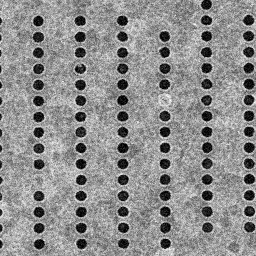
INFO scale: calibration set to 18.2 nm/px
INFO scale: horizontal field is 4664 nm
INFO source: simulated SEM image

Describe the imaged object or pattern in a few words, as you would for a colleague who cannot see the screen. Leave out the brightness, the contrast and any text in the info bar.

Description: a regular array of holes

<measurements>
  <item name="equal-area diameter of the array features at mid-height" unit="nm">206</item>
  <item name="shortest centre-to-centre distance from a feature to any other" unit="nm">289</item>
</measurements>